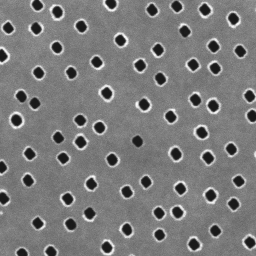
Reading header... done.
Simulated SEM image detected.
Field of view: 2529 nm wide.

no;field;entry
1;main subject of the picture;a regular array of holes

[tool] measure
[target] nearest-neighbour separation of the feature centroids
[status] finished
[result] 24.9 px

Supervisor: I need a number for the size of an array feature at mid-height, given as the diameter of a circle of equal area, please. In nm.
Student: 109